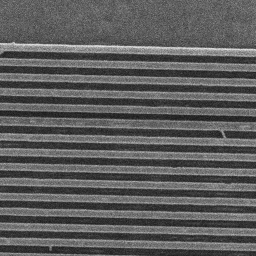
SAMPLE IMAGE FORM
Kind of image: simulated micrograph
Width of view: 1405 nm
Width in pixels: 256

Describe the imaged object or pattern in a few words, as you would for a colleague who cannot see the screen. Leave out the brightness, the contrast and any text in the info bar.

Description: parallel lines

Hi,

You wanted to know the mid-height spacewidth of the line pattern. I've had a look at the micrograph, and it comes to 42.5 nm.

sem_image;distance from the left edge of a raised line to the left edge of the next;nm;82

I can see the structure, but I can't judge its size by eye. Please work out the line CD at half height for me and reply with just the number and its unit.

37 nm